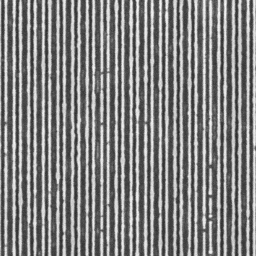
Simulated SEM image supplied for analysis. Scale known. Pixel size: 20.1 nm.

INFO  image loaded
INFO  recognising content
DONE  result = parallel lines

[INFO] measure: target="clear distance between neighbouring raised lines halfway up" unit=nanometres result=90.5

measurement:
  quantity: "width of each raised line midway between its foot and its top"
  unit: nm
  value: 37.7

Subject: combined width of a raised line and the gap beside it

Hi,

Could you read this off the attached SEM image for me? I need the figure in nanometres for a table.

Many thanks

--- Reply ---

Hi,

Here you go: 147